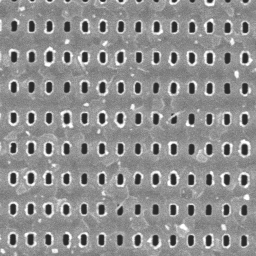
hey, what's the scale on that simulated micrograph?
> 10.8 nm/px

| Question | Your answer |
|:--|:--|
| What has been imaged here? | a regular array of holes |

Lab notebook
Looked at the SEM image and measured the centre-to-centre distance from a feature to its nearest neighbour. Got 189 nm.